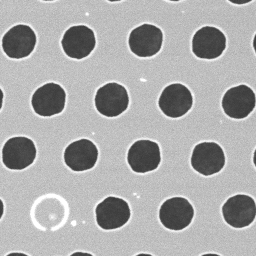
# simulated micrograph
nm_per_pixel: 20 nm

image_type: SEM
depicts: a regular array of holes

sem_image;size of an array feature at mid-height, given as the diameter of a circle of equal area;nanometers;691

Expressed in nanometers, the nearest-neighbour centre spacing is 1260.